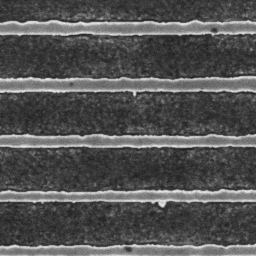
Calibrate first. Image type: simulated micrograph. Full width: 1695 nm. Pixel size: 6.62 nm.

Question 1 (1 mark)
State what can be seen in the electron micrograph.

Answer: lines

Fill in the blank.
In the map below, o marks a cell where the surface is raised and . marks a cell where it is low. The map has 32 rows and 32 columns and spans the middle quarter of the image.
................................
................................
................................
...o..........oo.....o..........
oooooooooooooooooooooooooooooooo
oooooooooooooooooooooooooooooooo
oooooooooooooooooooooooooooooooo
................................
................................
................................
................................
................................
................................
................................
................................
................................
................o...............
................................
oooooooooooooooooooooooooooooooo
oooooooooooooooooooooooooooooooo
oooooooooooooooooooooooooooooooo
................................
................................
................................
................................
................................
................................
................................
................................
................................
................................
............................o...